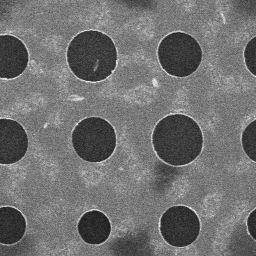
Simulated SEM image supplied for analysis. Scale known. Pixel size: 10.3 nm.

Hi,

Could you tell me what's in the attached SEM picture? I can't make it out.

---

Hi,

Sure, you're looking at holes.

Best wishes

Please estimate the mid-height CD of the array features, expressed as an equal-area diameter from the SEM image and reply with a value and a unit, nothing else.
463 nanometres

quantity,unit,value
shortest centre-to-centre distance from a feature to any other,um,0.874